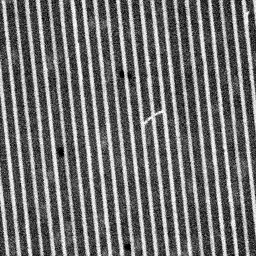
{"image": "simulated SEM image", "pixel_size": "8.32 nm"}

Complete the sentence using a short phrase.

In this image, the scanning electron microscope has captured parallel lines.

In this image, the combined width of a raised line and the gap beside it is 0.0946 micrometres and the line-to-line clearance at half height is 71.4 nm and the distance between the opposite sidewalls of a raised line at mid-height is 21.7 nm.